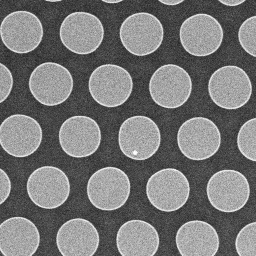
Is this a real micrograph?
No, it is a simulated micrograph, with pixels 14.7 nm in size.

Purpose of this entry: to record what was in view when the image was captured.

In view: an array of small figures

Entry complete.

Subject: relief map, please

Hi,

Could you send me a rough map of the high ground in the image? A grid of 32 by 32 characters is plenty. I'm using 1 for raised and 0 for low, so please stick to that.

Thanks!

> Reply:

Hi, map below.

00000000000000000000010000001100
00110000000000000000000000000000
11111000111100001111000111100001
11111000111110011111000111110011
11111000111110011111000111110011
01111000111100011111000111110011
00100000011000001110000011100001
00000000000000000000000000000000
10000111000011100000111000001100
10001111100111110001111100111110
11001111100111111001111100111110
10001111100111110001111100111110
00000111000011110001111000011110
00000000000000000000000000001100
00100000000000000100000000000000
11111000111100011110000111100001
11111001111100011111001111100011
11111001111100011111001111100011
11111000111100011111001111100011
00100000011000001110000111000001
00000000000000000000000000000000
00001111000011100000110000011100
10001111000111110001111000111110
10011111100111110011111100111110
10001111000111110011111100111110
00001111000011100001111000111110
00000000000000000000000000000000
01100000011000000000000000000000
11111000111100011110000111100011
11111001111100011111001111100011
11111001111100011111001111100011
11110000111100011110001111100011